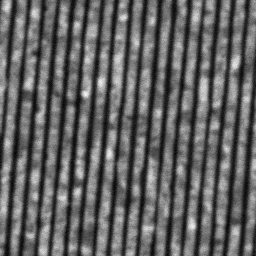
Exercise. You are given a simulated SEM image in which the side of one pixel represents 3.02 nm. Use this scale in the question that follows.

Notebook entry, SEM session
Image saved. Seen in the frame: parallel lines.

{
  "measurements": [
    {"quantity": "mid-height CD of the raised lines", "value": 25.9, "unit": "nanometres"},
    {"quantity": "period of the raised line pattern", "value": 43.9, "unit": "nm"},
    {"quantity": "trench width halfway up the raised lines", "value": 0.018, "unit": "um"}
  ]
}